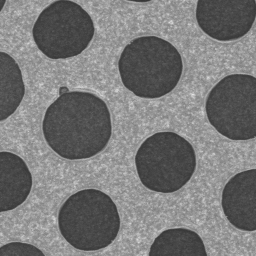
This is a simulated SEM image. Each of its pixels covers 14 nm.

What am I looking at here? holes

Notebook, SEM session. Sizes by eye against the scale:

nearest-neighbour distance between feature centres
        1320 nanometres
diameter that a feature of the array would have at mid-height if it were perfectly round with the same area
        876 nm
